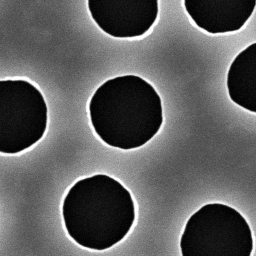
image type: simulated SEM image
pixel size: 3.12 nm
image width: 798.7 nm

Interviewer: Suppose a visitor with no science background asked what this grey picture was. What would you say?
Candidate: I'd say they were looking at holes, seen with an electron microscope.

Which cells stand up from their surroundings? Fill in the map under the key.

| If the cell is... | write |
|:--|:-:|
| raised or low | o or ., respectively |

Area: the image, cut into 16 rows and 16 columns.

oooooo....oo....
oooooo....oo...o
oooooooooooooooo
ooooooooooooooo.
oooooooooooooo..
..oooo....oooo..
...ooo....ooooo.
...ooo....oooooo
...ooo....oooooo
.ooooooooooooooo
oooooooooooooooo
ooooo...oooooooo
oooo....oooooooo
oooo....oooo...o
oooo....ooo.....
oooooo.oooo.....